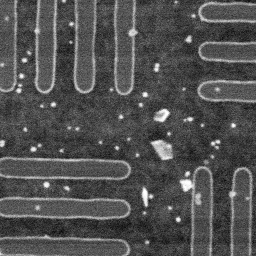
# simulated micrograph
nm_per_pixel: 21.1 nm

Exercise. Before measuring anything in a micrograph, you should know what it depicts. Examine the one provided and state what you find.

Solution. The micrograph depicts groups of lines, slits or small figures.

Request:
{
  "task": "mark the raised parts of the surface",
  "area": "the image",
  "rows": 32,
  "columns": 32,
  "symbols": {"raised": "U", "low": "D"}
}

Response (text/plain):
UUDDDUUDDUUUDDDUUDDDDDDDDDUUUUUD
UUDDDUUDDUUUDDUUUDDDDDDDDUUUUUUU
UUDDDUUDDDUUDDUUUDDDDDDDDUUUUUUU
UUDDDUUDDDUUDDUUUDDDDDDDDDDDDDDD
UUDDDUUDDDUUDDDUUDDDDDDDDDDDDDDD
UUDDDUUDDDUUDDDUUDDDDDDDDUUUUUUU
UUDDDUUDDDUUDDDUUDDDDDDDDUUUUUUU
UUDDDUUDDUUUDDDUUDDDDDDDDDDUUUUU
UUDDDUUDDUUUDDUUUDDDDDDDDDDDDDDD
UUDDDUUDDUUUDDUUUDDDDDDDDDDDDDDD
UUDDDUUDDUUUDDDUUDDDDDDDDUUUUUUU
DDDDDUDDDDUDDDDUDDDDDDDDDUUUUUUU
DDDDDDDDDDDDDDDDDDDDDDDDDDUUUUUU
DDDDDDDDDDDDDDDDDDDDDDDDDDDDDDDD
DDDDDDDDDDDDDDDDDDDDUDDDDDDDDDDD
DDDDDDDDDDDDDDDDDDDDDDDDDDDDDDDD
DDDDDDDDDDDDDDDDDDDDDDDDDDDDDDDD
DDDDDDDDDDDDDDDDDDDDDDDDDDDDDDDD
DDDDDDDDDDDDDDDDDDDDUDDDDDDDDDDD
DDDDDDDDDDDDDDDDDDDDUDDDDDDDDDDD
UUUUUUUUUUUUUUUUDDDDDDDDDDDDDDDD
UUUUUUUUUUUUUUUUDDDDDDDDUUDDDDUD
DDDDDDDDDDDDDDDDDDDDDDDDUUDDDUUD
DDDDDDDDDDDDDDDDDDDDDDDDUUDDDUUD
DDDDDDDDDDDDDDDDDDDDDDDDUUDDDUUD
UUUUUUUUUUUUUUUUDDDDDDDDUUDDDUUD
UUUUUUUUUUUUUUUUDDDDDDDDUUDDDUUD
DDDDDDDDDDDDDDDDDDDDDDDDUUDDDUUD
DDDDDDDDDDDDDDDDDDDDDDDDUUDDDUUD
DDDDDDDDDDDDDDDDDDDDDDDDUUDDDUUD
UUUUUUUUUUUUUUUUDDDDDDDDUUDDDUUD
UUUUUUUUUUUUUUUUDDDDDDDDUUDDDUUD